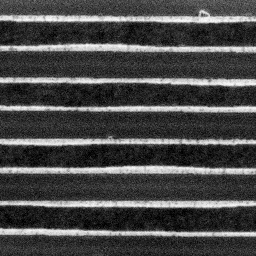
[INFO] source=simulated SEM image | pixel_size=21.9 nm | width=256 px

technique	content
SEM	lines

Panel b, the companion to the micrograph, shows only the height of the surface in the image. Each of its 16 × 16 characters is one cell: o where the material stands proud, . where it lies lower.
................
oooooooooooooooo
oooooooooooooooo
................
................
oooooooooooooooo
oooooooooooooooo
................
................
oooooooooooooooo
oooooooooooooooo
................
................
oooooooooooooooo
oooooooooooooooo
................